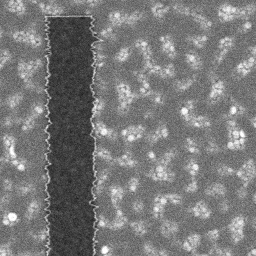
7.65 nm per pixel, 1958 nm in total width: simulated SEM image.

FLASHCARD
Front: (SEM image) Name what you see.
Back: one or a few lines or trenches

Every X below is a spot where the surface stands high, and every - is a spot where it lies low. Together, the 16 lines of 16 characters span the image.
----------------
---XXX----------
---XXX----------
---XXX----------
---XXX----------
---XXX----------
---XXX----------
---XXX----------
---XXX----------
---XXX----------
---XXX----------
---XXX----------
---XXX----------
---XXX----------
---XXX----------
---XXX----------